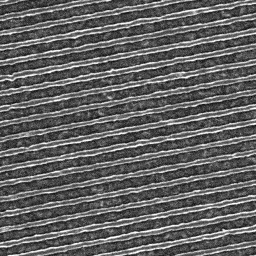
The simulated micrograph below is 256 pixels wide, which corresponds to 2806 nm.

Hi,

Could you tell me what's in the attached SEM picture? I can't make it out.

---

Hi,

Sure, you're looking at parallel lines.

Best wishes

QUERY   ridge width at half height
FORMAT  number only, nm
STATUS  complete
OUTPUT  45.8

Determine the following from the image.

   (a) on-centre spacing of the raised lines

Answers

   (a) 163 nanometers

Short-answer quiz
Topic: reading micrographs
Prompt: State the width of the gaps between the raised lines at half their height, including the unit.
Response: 110 nm